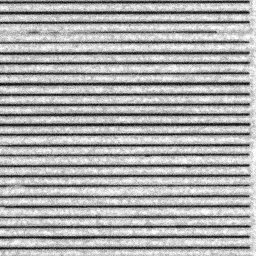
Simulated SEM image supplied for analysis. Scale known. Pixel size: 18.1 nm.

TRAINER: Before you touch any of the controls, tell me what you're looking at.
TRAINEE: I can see parallel lines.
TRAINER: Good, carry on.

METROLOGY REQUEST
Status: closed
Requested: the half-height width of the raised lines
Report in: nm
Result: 138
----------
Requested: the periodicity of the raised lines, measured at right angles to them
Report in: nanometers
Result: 185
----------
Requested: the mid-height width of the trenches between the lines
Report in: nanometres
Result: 45.3